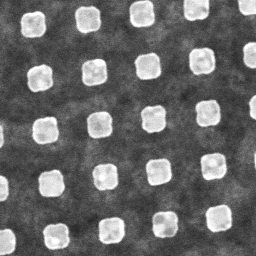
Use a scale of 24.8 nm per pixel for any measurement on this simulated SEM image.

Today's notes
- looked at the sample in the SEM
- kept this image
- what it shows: a regular array of raised bodies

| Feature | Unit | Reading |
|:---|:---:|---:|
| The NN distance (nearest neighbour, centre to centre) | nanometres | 1310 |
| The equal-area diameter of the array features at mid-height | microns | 0.633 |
